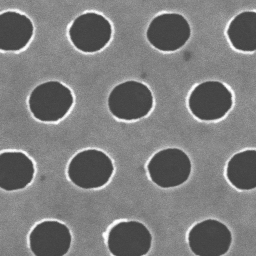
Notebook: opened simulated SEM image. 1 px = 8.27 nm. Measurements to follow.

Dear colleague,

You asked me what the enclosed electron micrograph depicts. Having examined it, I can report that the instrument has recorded holes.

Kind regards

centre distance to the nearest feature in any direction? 0.647 um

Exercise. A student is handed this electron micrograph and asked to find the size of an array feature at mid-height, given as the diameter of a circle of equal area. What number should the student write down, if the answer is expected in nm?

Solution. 340